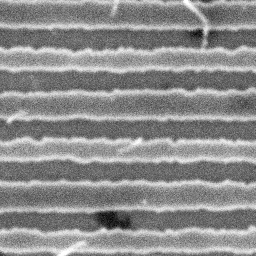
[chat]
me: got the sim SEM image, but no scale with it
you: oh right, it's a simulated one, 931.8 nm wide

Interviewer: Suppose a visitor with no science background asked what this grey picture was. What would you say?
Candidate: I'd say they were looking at lines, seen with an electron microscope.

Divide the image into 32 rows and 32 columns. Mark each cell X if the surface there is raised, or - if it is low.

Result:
XXXXXXXXXXXXXXXXXXXXXXXXXXXXXXXX
XXXXXXXXXXXXXXXXXXXXXXXXXXXXXXXX
XXXXXXXXXXXXXXXXXXXXXXXXXXXXXXXX
------X----X--X-XXXXXXXXXXXXXX-X
--------------------------------
--------------------------------
XXXXXXXXX-XX-XXXXX-XXXXXXXXXXXXX
XXXXXXXXXXXXXXXXXXXXXXXXXXXXXXXX
XXXXXXXXXXXXXXXXXXXXXXXXXXXXXXXX
--------------------------------
--------------------------------
---------XX---XXXXXXXXX-XXX-XXXX
XXXXXXXXXXXXXXXXXXXXXXXXXXXXXXXX
XXXXXXXXXXXXXXXXXXXXXXXXXXXXXXXX
XXXXXXXXXXXXXXXXXXXXXXXXXXXXXXXX
--------------------------------
--------------------------------
--XX--XXXXX-X-------------------
XXXXXXXXXXXXXXXXXXXXXXXXXXXXXXXX
XXXXXXXXXXXXXXXXXXXXXXXXXXXXXXXX
--------------------------------
--------------------------------
--------------------------------
XXXXXXXXXXXXXXXXXXXXXXXXXXXXXXXX
XXXXXXXXXXXXXXXXXXXXXXXXXXXXXXXX
XXXXXXXXXXXXXXXXXXXXXXXXXXXXXXXX
--------------------------------
--------------------------------
-------------------------------X
XXXXXXXXXXXXXXXXXXXXXXXXXXXXXXXX
XXXXXXXXXXXXXXXXXXXXXXXXXXXXXXXX
--X----XX----X---X------X----XX-